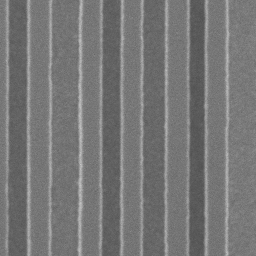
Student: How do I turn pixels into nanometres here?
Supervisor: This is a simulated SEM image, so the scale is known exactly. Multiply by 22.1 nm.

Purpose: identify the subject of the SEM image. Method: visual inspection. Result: lines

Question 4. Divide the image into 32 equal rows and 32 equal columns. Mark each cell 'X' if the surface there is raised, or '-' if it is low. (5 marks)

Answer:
X--XXX----XXX--XXX---XXX--XX----
X--XXX----XXX--XXX---XXX--XX----
X--XXX----XXX--XXX---XXX--XX----
X--XXX----XXX--XXX---XXX--XX----
X--XXX----XXX--XXX---XXX--XXX---
X--XXX----XXX--XXX---XXX--XX----
X--XXX----XXX--XXX---XXX--XX----
X--XXX----XXX--XXX---XXX--XX----
X--XXX----XXX--XXX---XXX--XX----
X--XXX----XXX--XXX---XXX--XX----
X--XXX----XXX--XXX---XXX--XX----
X--XXX----XXX--XXX---XXX--XX----
X--XXX----XXX--XXX---XXX--XX----
X--XXX----XXX--XXX---XXX--XX----
X--XXX----XXX--XXX---XXX--XX----
X--XXX----XXX--XXX---XXX--XX----
X--XXX----XXX--XXX---XXX--XX----
X--XXX----XXX--XXX---XXX--XX----
X--XXX----XXX--XXX---XXX--XX----
X--XXX----XXX--XXX---XXX--XX----
X--XXX----XXX--XXX---XXX--XX----
X--XXX----XXX--XXX---XXX--XX----
X--XXX----XXX--XXX---XXX--XX----
X--XXX----XXX--XXX---XXX--XX----
X--XXX----XXX--XXX---XXX--XX----
X--XXX----XXX--XXX---XXX--XX----
X--XXX----XXX--XXX---XXX--XX----
X--XXX----XXX--XXX---XXX--XX----
X--XXX----XXX--XXX---XXX--XX----
X--XXX----XXX--XXX---XXX--XX----
X--XXX----XXX--XXX---XXX--XX----
X--XXX----XXX--XXX---XXX--XX----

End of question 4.